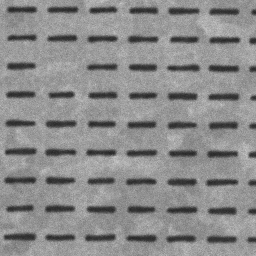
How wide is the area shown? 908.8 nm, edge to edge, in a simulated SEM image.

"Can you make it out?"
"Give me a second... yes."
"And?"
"a regular array of holes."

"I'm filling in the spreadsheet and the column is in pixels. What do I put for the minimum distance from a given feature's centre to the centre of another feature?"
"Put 28.2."